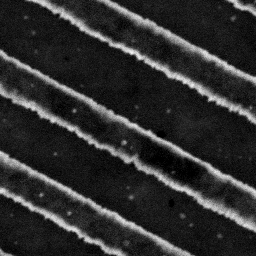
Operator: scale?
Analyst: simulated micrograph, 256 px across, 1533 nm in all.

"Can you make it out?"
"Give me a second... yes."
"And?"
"lines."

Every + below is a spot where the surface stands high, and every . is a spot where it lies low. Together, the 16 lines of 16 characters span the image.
...+++++.......+
.....+++++......
......+++++.....
+........++++...
++........+++++.
++++........++++
.+++++........++
...+++++........
.....+++++......
.......++++.....
++.......++++...
++++.......++++.
.+++++......++++
...++++.......++
.....++++.......
......+++++.....